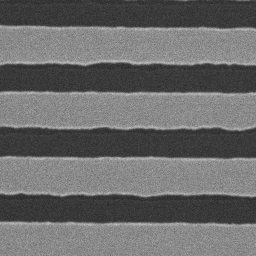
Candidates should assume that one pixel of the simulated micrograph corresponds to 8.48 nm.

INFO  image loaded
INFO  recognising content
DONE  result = lines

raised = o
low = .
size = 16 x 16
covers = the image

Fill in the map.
................
................
oooooooooooooooo
oooooooooooooooo
................
................
oooooooooooooooo
oooooooooooooooo
................
................
oooooooooooooooo
oooooooooooooooo
................
................
oooooooooooooooo
oooooooooooooooo